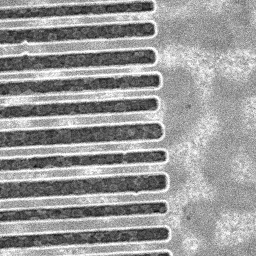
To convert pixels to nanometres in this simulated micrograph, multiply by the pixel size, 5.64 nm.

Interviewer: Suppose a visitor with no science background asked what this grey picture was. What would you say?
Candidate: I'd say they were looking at parallel lines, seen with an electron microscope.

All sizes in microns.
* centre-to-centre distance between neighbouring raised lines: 0.144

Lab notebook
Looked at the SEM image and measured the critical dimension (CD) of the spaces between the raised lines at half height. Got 93 nm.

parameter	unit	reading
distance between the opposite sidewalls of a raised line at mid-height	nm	49.3